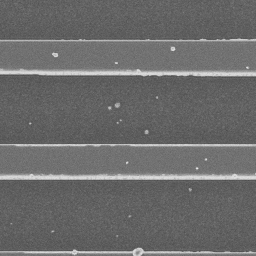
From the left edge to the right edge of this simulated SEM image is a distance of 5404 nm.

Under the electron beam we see lines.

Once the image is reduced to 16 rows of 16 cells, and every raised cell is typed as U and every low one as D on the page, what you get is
DDDDDDDDDDDDDDDD
DDDDDDDDDDDDDDDD
DDDDDDDDDDDDDDDD
UUUUUUUUUUUUUUUU
UUUUUUUUUUUUUUUU
DDDDDDDDDDDDDDDD
DDDDDDDDDDDDDDDD
DDDDDDDDDDDDDDDD
DDDDDDDDDDDDDDDD
UUUUUUUUUUUUUUUU
UUUUUUUUUUUUUUUU
DDDDDDDDDDDDDDDD
DDDDDDDDDDDDDDDD
DDDDDDDDDDDDDDDD
DDDDDDDDDDDDDDDD
DDDDDDDDDDDDDDDD